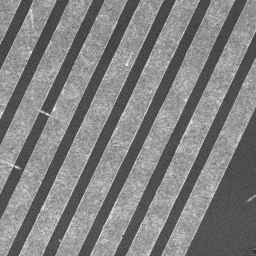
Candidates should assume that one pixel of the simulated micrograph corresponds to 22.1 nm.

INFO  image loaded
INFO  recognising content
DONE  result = parallel lines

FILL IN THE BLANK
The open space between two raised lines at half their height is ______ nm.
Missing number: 264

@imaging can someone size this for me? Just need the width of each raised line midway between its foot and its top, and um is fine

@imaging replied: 0.452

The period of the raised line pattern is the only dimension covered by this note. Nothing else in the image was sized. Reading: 712 nm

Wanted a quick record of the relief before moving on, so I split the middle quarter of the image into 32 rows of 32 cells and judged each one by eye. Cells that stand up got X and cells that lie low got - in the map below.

--XXXXXX---X-XXXX---XXXXXX---XXX
--XXXXXX---XXXXX----XXXXX----XXX
-XXXXXX---XXXXXX---XXXXXX---XXXX
-XXXXXX---XXXXXX---XXXXX----XXXX
-XXXXX----XXXXX---XXXXXX---XXXXX
XXXXXX---XXXXXX---XXXXX----XXXXX
-XXXX----XXXXX----XXXXX----XXXXX
-XXXX---XXXXXX---XXXXXX---XXXXX-
XXXX----XXXXX----XXXXX----XXXXX-
XXXX---XXXXXX---XXXXXX---XXXXXX-
XXX----XXXXX----XXXXX----XXXXX--
XXX---XXXXXX---XXXXXX---XXXXXX--
XX----XXXXX----XXXXX----XXXXX---
XX---XXXXXX---X-XXXX---XXX-XX---
X----XXXXX----XXXXX----XXX-X----
X---XXXXXX---XXXXXX---XX---X---X
----XXXXX----XXXXX----XXXXX----X
---XXXXXX---XXXXXX---XXXXXX---XX
---XXXXX----XXXXX----XXXXX----XX
--XXXXXX---XXXXXX---XXXXXX---XXX
--XXXXX----XXXXX----XXXXX----XXX
-XXXXXX---XXXXXX---XXXXXX---XXXX
-XXXXXX---XXXXX----XXXXX----XXXX
XXXXXX---XXXXXX---XXXXXX---XXXXX
XXXXXX---XXXXXX---XXXXX----XXXXX
XXXXX----XXXXX---XXXXXX---XXXXXX
XXXXX---XXXXX----XXXXX----XXXXX-
XXXX----XXXXX---XXXXXX----XXXXX-
XXXX---XXXXXX---XXXXX----XXXXX--
XXX----XXXXX---XXXXXX-----XXXX--
XXX---XXXXXX---XXXXXX---XXXXXX--
XX----XXXXX----XXXXX---XXXXXX---